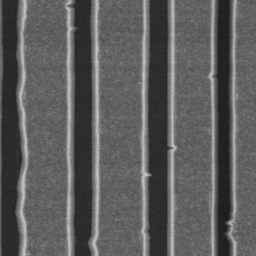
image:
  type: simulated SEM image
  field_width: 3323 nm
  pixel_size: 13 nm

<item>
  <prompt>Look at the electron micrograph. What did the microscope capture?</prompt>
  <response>one or a few lines or trenches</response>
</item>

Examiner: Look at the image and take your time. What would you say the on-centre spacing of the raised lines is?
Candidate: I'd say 0.951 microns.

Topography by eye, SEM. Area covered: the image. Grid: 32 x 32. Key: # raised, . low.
...######...######...######..###
...######...######...######..###
...######...######...######..###
...######...######...######..###
...######...######...######..###
...######...######...######..###
...######...######...######..###
...######...######...######..###
...######...######...######..###
...######...######...######..###
...######...######...######..###
..#######...######...######..###
..#######...######...######..###
...######...######...######..###
...######...######...######..###
...######...######...######..###
...######...######...######..###
...######...######...######..###
...######...######...######..###
...######...######...######..###
...######...######...######..###
...######...######...######..###
...######...######...######..###
...######...######...######..###
...######...######...######..###
...######...######...######..###
..#######...######...######..###
...######...######...######..###
...######...######...######..###
...######...######...######..###
...######..#######...######..###
...######...######...######..###